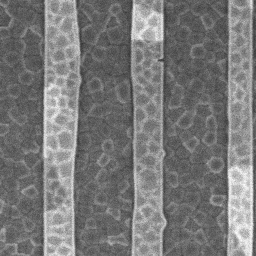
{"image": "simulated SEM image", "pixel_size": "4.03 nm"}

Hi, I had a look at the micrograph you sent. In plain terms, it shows one or a few lines or trenches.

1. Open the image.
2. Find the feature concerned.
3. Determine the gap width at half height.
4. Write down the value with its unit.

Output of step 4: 0.253 um